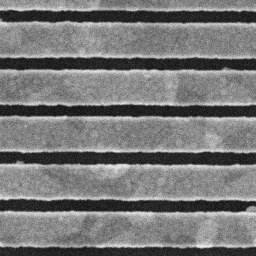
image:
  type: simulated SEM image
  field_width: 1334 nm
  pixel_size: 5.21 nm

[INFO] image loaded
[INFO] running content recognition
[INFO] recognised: lines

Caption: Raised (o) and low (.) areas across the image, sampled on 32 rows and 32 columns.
oooooooooooooooooooooooooooooooo
................................
................................
oooooooooooooooooooooooooooooooo
oooooooooooooooooooooooooooooooo
oooooooooooooooooooooooooooooooo
oooooooooooooooooooooooooooooooo
................................
................................
oooooooooooooooooooooooooooooooo
oooooooooooooooooooooooooooooooo
oooooooooooooooooooooooooooooooo
oooooooooooooooooooooooooooooooo
................................
................................
oooooooooooooooooooooooooooooooo
oooooooooooooooooooooooooooooooo
oooooooooooooooooooooooooooooooo
oooooooooooooooooooooooooooooooo
................................
................................
oooooooooooooooooooooooooooooooo
oooooooooooooooooooooooooooooooo
oooooooooooooooooooooooooooooooo
oooooooooooooooooooooooooooooooo
................................
................................
oooooooooooooooooooooooooooooooo
oooooooooooooooooooooooooooooooo
oooooooooooooooooooooooooooooooo
oooooooooooooooooooooooooooooooo
................................